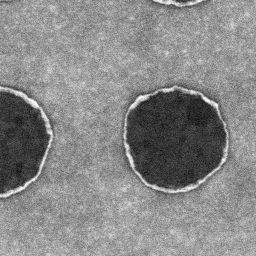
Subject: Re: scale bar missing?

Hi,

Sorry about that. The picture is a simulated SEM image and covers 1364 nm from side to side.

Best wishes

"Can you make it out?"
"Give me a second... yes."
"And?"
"raised bodies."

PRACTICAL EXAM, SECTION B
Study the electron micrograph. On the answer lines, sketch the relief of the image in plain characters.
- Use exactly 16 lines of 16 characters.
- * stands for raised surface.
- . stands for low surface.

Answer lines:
................
................
................
................
................
................
**......*****...
***.....******..
***.....******..
***.....******..
***.....******..
**.......***....
................
................
................
................